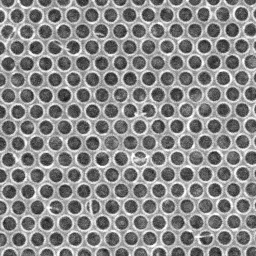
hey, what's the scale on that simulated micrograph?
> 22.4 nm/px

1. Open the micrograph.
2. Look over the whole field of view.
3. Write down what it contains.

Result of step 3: a regular array of holes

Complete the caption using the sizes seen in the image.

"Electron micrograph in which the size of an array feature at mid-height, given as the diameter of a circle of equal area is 324 nm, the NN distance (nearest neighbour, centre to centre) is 410 nm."